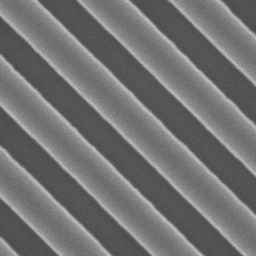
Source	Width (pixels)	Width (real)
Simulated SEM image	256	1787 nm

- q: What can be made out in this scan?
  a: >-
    lines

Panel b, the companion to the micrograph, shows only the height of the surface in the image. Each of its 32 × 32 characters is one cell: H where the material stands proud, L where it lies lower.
HHHHHLLLLLHHHHHHHLLLLLHHHHHHLLLL
HHHHHHLLLLLHHHHHHHLLLLLHHHHHHLLL
LHHHHHHLLLLLHHHHHHHLLLLLHHHHHHLL
LLHHHHHHLLLLLHHHHHHHLLLLLHHHHHHL
LLLHHHHHHLLLLLHHHHHHHLLLLLHHHHHH
LLLLHHHHHHLLLLLHHHHHHHLLLLLHHHHH
LLLLLHHHHHHLLLLLHHHHHHHLLLLLHHHH
HLLLLLHHHHHHLLLLLHHHHHHHLLLLLHHH
HHLLLLLHHHHHHLLLLLHHHHHHHLLLLLHH
HHHLLLLLHHHHHHLLLLLHHHHHHHLLLLLH
HHHHLLLLLHHHHHHLLLLLHHHHHHHLLLLL
HHHHHLLLLLHHHHHHLLLLLHHHHHHHLLLL
HHHHHHLLLLLHHHHHHLLLLLHHHHHHHLLL
HHHHHHHLLLLLHHHHHHLLLLLHHHHHHHLL
LHHHHHHHLLLLLHHHHHHLLLLLHHHHHHHL
LLHHHHHHHLLLLLHHHHHHLLLLLHHHHHHH
LLLHHHHHHHLLLLLHHHHHHLLLLLHHHHHH
LLLLHHHHHHHLLLLLHHHHHHLLLLLHHHHH
LLLLLHHHHHHHLLLLLHHHHHHLLLLLHHHH
HLLLLLHHHHHHHLLLLLHHHHHHLLLLLHHH
HHLLLLLHHHHHHHLLLLLHHHHHHLLLLLHH
HHHLLLLLHHHHHHHLLLLLHHHHHHLLLLLH
HHHHLLLLLLHHHHHHLLLLLHHHHHHLLLLL
HHHHHLLLLLHHHHHHHLLLLLHHHHHHLLLL
HHHHHHLLLLLLHHHHHHLLLLLHHHHHHLLL
LHHHHHHLLLLLHHHHHHHLLLLLHHHHHHLL
LLHHHHHHLLLLLHHHHHHHLLLLLHHHHHHH
LLLHHHHHHLLLLLHHHHHHHLLLLLHHHHHH
LLLLHHHHHHLLLLLHHHHHHHLLLLLHHHHH
LLLLLHHHHHHHLLLLLHHHHHHLLLLLHHHH
HLLLLLHHHHHHLLLLLLHHHHHHLLLLLHHH
HHLLLLLHHHHHHLLLLLLHHHHHHLLLLLHH